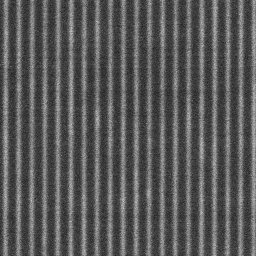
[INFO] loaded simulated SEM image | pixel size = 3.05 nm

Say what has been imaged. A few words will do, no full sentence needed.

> parallel lines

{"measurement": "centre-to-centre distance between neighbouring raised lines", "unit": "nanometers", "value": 39.9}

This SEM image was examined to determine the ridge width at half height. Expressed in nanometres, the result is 7.2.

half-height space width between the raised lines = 32.8 nanometers